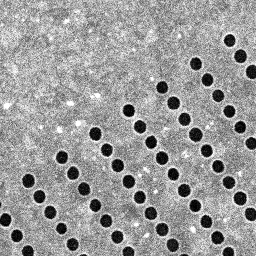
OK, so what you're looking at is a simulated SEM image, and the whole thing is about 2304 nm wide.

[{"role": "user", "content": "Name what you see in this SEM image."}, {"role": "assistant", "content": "a regular array of holes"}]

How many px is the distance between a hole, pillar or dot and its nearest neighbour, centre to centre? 19.2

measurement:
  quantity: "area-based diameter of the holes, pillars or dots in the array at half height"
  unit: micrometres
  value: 0.12